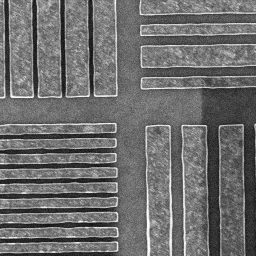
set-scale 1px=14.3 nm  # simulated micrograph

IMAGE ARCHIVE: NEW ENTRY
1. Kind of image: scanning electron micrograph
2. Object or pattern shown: groups of lines, slits or small figures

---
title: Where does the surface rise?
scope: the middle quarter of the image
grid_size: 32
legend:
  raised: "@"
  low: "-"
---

-@@@@@--@@@@@-------@@@@@@@@---@
-@@@@@--@@@@@-------------------
-@@@@@--@@@@@-------------------
-@@@@@--@@@@@-------@@@@@@@@@@@@
-@@@@@--@@@@@------@@@@@@@@@@@@@
-@@@@@--@@@@@------@@@@@@@@@@@@@
-@@@@@--@@@@@-------------------
-@@@@@--@@@@@-------------------
--------------------------------
--------------------------------
--------------------------------
--------------------------------
--------------------------------
--------------------------------
--------------------------------
@@@@@@@@@@@@@---------@@@@----@@
@@@@@@@@@@@@@--------@@@@@----@@
---------------------@@@@@----@@
---------------------@@@@@----@@
@@@@@@@@@@@@@--------@@@@@----@@
@@@@@@@@@@@@@--------@@@@@----@@
---------------------@@@@@----@@
--@@@@@@@@@@@--------@@@@@----@@
@@@@@@@@@@@@@--------@@@@@----@@
@@---@@@@@@----------@@@@@----@@
---------------------@@@@@----@@
@@@@@@@@@@@@@--------@@@@@----@@
@@@@@@@@@@@@@--------@@@@@----@@
---------------------@@@@@----@@
---------------------@@@@@----@@
@@@@@@@@@@@@@--------@@@@@----@@
@@@@@@@@@@@@@--------@@@@@----@@